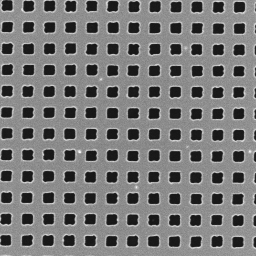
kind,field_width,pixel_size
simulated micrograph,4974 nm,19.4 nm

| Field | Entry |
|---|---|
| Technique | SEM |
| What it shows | a regular array of holes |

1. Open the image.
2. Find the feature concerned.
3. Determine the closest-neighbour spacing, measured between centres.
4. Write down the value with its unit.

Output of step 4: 406 nanometres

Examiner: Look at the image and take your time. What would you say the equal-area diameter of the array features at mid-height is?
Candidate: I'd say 0.234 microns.